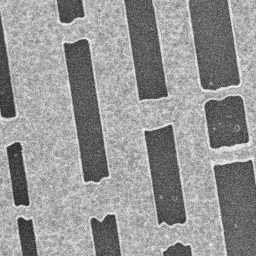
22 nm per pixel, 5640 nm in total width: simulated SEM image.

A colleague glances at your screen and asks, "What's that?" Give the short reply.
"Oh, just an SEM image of one or a few lines or trenches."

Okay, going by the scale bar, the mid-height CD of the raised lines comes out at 890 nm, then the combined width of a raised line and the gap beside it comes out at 1540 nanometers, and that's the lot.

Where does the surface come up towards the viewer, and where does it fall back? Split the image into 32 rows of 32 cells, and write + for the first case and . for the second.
+++++++...++++++...+++++.....+++
+++++++....+++++...+++++.....+++
+++++++..+++++++....++++.....+++
++++++++++++++++....++++.....+++
.+++++++++++++++....++++.....+++
.+++++++...+++++....++++.....+++
.+++++++...+++++....++++......++
.+++++++...++++++...+++++.....++
.+++++++....+++++...+++++.....++
.+++++++....+++++....++++.....++
..+++++++...+++++....++++.....++
..+++++++...+++++....+++++++++++
..+++++++...++++++.+++++++....++
..+++++++...+++++++++++++......+
..+++++++....+++++++++++++.....+
+++++++++....+++++++++++++.....+
++++++++++...+++++....++++.....+
++++++++++...+++++....++++.....+
+..+++++++...+++++....++++..++++
+..+++++++...+++++....++++++++++
+..+++++++....+++++...+++++.....
+..+++++++....+++++....++++.....
+..++++++++..++++++....++++.....
+...+++++++++++++++....++++.....
++..+++++++++++++++....++++.....
++..+++++++++++++++....++++.....
+++++++++++++++++++....++++.....
++..+++++++.+..+++++...+++++....
++..+++++++....+++++++++++++....
++..++++++++...+++++++++++++....
+++..+++++++...+++++++.+++++....
+++..+++++++...+++++....++++....